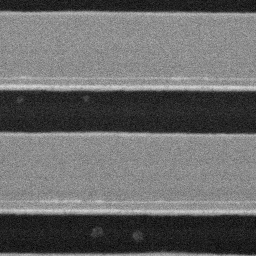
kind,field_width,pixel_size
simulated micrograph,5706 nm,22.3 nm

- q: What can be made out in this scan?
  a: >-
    lines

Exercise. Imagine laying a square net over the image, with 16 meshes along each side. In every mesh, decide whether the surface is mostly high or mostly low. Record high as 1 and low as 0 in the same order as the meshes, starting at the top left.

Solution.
0000000000000000
1111111111111111
1111111111111111
1111111111111111
1111111111111111
0000000000000000
0000000000000000
0000000000000000
1111111111111111
1111111111111111
1111111111111111
1111111111111111
1111111111111111
0000000000000000
0000000000000000
0000000000000000